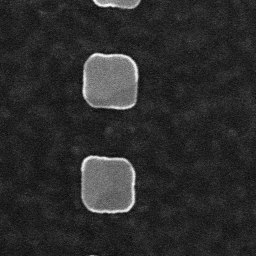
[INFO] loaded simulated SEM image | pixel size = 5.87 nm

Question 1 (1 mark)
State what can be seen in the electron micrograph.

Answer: raised bodies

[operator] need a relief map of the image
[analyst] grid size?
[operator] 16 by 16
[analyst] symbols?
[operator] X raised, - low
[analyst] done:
----------------
----------------
----------------
------XX--------
-----XXXX-------
-----XXXX-------
------XX--------
----------------
----------------
----------------
-----XXX--------
-----XXX--------
-----XXX--------
----------------
----------------
----------------